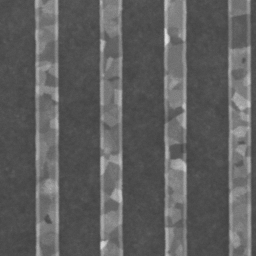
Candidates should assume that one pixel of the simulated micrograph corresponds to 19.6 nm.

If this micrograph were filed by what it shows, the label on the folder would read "one or a few lines or trenches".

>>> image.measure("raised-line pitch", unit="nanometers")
1260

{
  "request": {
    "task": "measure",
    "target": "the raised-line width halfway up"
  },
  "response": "364 nanometres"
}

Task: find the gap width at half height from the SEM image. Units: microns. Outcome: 0.882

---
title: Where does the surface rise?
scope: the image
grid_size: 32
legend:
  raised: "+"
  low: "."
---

.....++......++......++......++.
.....++......++......++......++.
.....++......++......++......++.
.....++......++......++......++.
.....++......++......++......++.
.....++......++......++......++.
.....++......++......++......++.
.....++......++......++......++.
.....++......++......++......++.
.....++......++......++......++.
.....++......++......++......++.
.....++......++......++......++.
.....++......++......++......++.
.....++......++......++......++.
.....++......++......++......++.
.....++......++......++......++.
.....++......++......++......++.
.....++......++......++......++.
.....++......++......++......++.
.....++......++......++......++.
.....++......++......++......++.
.....++......++......++......++.
.....++......++......++......++.
.....++......++......++......++.
.....++......++......++......++.
.....++......++......++......++.
.....++......++......++......++.
.....++......++......++......++.
.....++......++......++......++.
.....++......++......++......++.
.....++......++......++......++.
.....++......++......++......++.